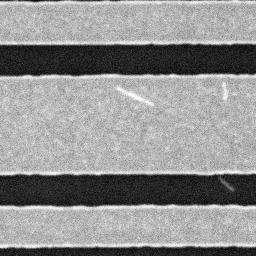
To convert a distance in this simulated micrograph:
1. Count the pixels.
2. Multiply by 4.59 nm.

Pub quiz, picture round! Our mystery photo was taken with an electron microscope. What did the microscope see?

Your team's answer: lines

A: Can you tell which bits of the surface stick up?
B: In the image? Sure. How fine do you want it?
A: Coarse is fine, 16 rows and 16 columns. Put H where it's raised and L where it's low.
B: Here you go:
HHHHHHHHHHHHHHHH
HHHHHHHHHHHHHHHH
HHHHHHHHHHHHHHHH
LLLLLLLLLLLLLLLL
LLLLLLLLLLLLLLLL
HHHHHHHHHHHHHHHH
HHHHHHHHHHHHHHHH
HHHHHHHHHHHHHHHH
HHHHHHHHHHHHHHHH
HHHHHHHHHHHHHHHH
HHHHHHHHHHHHHHHH
LLLLLLLLLLLLLLLL
LLLLLLLLLLLLLLLL
HHHHHHHHHHHHHHHH
HHHHHHHHHHHHHHHH
LLLLLLLLLLLLLLLL